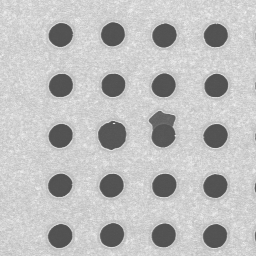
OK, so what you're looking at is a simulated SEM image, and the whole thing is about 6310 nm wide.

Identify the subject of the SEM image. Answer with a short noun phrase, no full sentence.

a regular array of holes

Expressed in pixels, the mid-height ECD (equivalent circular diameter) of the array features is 24.2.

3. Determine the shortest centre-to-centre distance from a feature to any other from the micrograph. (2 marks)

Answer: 1230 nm